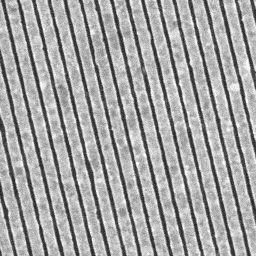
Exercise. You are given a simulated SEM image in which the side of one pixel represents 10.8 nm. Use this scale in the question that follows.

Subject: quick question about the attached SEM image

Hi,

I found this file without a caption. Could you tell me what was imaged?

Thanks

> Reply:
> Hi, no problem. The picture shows parallel lines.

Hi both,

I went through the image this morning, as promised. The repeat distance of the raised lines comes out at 15.2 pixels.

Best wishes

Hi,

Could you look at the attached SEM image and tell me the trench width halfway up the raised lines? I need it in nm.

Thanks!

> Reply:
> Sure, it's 50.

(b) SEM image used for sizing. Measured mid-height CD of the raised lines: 117 nm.